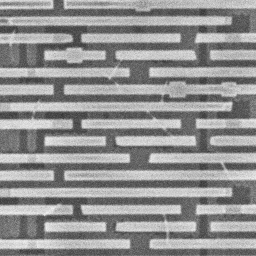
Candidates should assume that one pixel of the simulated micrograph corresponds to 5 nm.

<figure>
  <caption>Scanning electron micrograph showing wiring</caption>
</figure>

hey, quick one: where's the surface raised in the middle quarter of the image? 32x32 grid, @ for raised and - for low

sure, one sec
--------------------------------
@@@@@@@@@@@@@@@@------@@@@@@@@@@
@@@@@@@@@@@@@@@@------@@@@@@@@@@
-----------@--------------------
--------------------------------
@@@@@@@@@@@@@@@@@@@@@@@@@@@@@@@@
@@@@@@@@@@@@@@@@@@@@@@@@@@@@@@@@
------------------------@-@@@@@-
--------------------------------
------------------------@-------
@@@@@@@@@@@@@@@@@@@@@@@@@@@@@@@@
@@@@@@@@@@@@@@@@@@@@@@@@@@@@@@@@
--------------------------------
--------------------------------
@@---@@@@@@@@@@@@@@@@@@@@@@@@---
@@---@@@@@@@@@@@@@@@@@@@@@@@@---
--------------------------------
--------------------------------
@@@@@@@@@@---@@@@@@@@@@@@@@@@@@@
@@@@@@@@@@---@@@@@@@@@@@@@@@@@@@
--------------------------------
--------------------------------
--------------------------------
@@@@@@@@@@@@@@@@------@@@@@@@@@@
@@@@@@@@@@@@@@@@-----@@@@@@@@@@@
--------------------------------
--------------------------------
@@@@@@@@@@@@@@@@@@@@@@@@@@@@@@@@
@@@@@@@@@@@@@@@@@@@@@@@@@@@@@@@@
--------------------------------
--------------------------------
@@@@@@@@@@@@@@@@@@@@@@@@@@@@@@@@